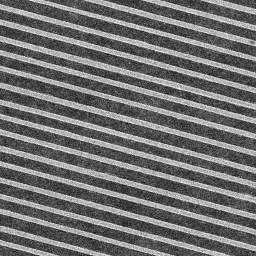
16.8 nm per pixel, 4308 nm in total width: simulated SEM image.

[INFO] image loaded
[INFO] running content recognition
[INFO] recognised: parallel lines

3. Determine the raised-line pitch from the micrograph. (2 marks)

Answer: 256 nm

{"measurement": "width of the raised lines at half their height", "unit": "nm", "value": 77.2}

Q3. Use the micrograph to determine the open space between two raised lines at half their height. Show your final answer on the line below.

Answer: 173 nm